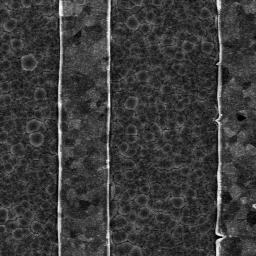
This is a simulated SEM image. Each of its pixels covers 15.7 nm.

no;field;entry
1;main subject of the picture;one or a few lines or trenches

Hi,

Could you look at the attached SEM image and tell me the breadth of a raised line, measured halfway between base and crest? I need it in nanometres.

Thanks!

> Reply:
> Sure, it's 779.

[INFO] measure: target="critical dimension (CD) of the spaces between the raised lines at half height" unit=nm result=1720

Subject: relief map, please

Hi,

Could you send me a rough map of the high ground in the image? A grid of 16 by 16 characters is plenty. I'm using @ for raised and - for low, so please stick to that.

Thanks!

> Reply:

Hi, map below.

----@@@-------@@
----@@@-------@@
----@@@-------@@
----@@@-------@@
----@@@-------@@
----@@@-------@@
----@@@-------@@
----@@@-------@@
----@@@-------@@
----@@@-------@@
----@@@-------@@
----@@@-------@@
----@@@-------@@
----@@@-------@@
----@@@-------@@
----@@@-------@@